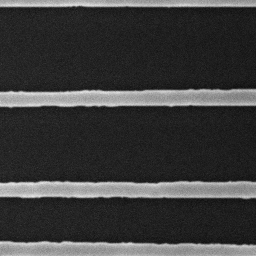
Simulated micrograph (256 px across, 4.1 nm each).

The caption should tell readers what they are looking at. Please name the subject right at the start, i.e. lines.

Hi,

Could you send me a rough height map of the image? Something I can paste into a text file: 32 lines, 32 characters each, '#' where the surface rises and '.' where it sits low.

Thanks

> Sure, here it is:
################################
................................
................................
................................
................................
................................
................................
................................
................................
................................
................................
.##.....########################
################################
................................
................................
................................
................................
................................
................................
................................
................................
................................
................................
################################
################################
................................
................................
................................
................................
................................
#####################.###.#.....
################################